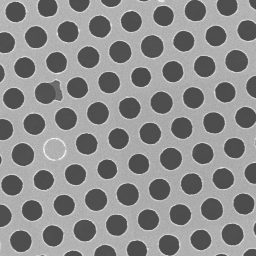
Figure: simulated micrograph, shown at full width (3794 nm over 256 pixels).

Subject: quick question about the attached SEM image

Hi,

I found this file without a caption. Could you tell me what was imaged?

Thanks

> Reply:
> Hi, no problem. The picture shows a regular array of holes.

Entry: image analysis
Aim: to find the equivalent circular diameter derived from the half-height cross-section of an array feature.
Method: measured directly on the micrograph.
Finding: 21.5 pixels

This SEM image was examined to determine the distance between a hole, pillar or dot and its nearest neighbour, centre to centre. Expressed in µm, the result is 0.477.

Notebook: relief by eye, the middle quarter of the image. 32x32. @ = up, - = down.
-@@@@---@@@@@@@@@@@@@@@@@----@@@
@@@@@@@@@@@@@@@@@@---@@@@-----@@
@@@@@@@@@@---@@@@-----@@@-----@@
@@---@@@@-----@@@-----@@@----@@@
@----@@@@-----@@@----@@@@@--@@@@
@-----@@@-----@@@@---@@@@@@@@@@@
@-----@@@----@@@@@@@@@@@@@@@@@@-
@-----@@@@@@@@@@@@@@@@@---@@@@--
@@@-@@@@@@@@@@@---@@@@-----@@@--
@@@@@@@@-@@@@@-----@@@-----@@@--
@@@@@@-----@@@-----@@@-----@@@@-
--@@@@-----@@@-----@@@-----@@@@@
---@@@-----@@@-----@@@@@@@@@@@@@
---@@@-----@@@@---@@@@@@@@@@--@@
---@@@@---@@@@@@@@@@@@@@@@@-----
---@@@@@@@@@@@@@@@@@----@@@-----
@@@@@@@@@@@@---@@@@-----@@@-----
@@@@@--@@@@-----@@@-----@@@-----
@@@-----@@@-----@@@-----@@@@@--@
@@@-----@@@-----@@@@---@@@@@@@@@
@@@-----@@@@----@@@@@@@@@@@@@@@@
@@@-----@@@@@@@@@@@@@@@@@---@@@@
@@@@@--@@@@@@@@@@@-@@@@@-----@@@
@@@@@@@@@@@@@@@@@----@@@------@@
@@@@@@@@@---@@@@-----@@@-----@@@
@---@@@@-----@@@-----@@@@----@@@
-----@@@-----@@@@----@@@@@-@@@@@
------@@@----@@@@@-@@@@@@@@@@@@-
-----@@@@@--@@@@@@@@@@@@@@@@@@--
@----@@@@@@@@@@@@@@@@@----@@@---
@@@@@@@@@@@@@@----@@@-----@@@---
@@@@@@@--@@@@-----@@@------@@@--